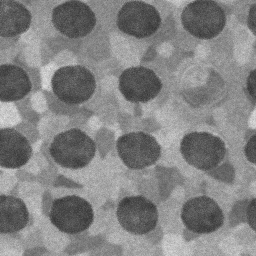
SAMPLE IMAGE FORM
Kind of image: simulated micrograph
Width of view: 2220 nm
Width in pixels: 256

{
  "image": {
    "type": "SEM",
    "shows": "a regular array of holes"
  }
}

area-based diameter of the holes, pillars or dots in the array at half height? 367 nm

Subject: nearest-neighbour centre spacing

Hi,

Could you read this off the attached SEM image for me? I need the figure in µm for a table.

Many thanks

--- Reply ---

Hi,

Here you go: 0.562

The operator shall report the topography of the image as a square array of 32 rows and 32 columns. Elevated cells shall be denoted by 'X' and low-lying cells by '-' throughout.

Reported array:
---XXXX----XXXXX---XXXXX---XXXXX
----XXX-----XXX-----XXX-----XXX-
----XX------XXX-----XXX-----XXX-
----XXX-----XXX-----XXX-----XXX-
--XXXXXX---XXXXX---XXXXX---XXXXX
XXXXXXXXXXXXXXXXXXXXXXXXXXXXXXXX
XXXXXXXXXXXXXXXXXXXXXXXXXXXXXXXX
XXXXXXXXXXXXXXXXXXXXXXXXXXXXXXXX
---XXXX----XXXXX--XXXXXX---XXXXX
----XX------XXX-----XXX-----XXX-
----XX------XXX-----XXX-----XXX-
----XXX-----XXX-----XXX-----XXX-
--XXXXX----XXXXX---XXXXX---XXXXX
XXXXXXXXXXXXXXXXXXXXXXXXXXXXXXXX
XXXXXXXXXXXXXXXXXXXXXXXXXXXXXXXX
XXXXXXXXXXXXXXXXXXXXXXXXXXXXXXXX
--XXXXXX---XXXXX--XXXXXX--XXXXXX
---XXXX-----XXX-----XXX-----XXX-
----XX------XXX-----XX------XXX-
----XX------XXX-----XXX-----XXX-
---XXXX----XXXX----XXXX-----XXX-
XXXXXXXXXXXXXXXXXXXXXXXXXXXXXXXX
XXXXXXXXXXXXXXXXXXXXXXXXXXXXXXXX
XXXXXXXXXXXXXXXXXXXXXXXXXXXXXXXX
-XXXXXXX--XXXXXXX-XXXXXXX-XXXXXX
---XXX-----XXXX----XXXX----XXXX-
----XX------XX------XXX-----XXX-
----XX------XXX-----XXX-----XXX-
---XXXX----XXXX----XXXX----XXXX-
XXXXXXXXXXXXXXXXXXXXXXXXXXXXXXXX
XXXXXXXXXXXXXXXXXXXXXXXXXXXXXXXX
XXXXXXXXXXXXXXXXXXXXXXXXXXXXXXXX